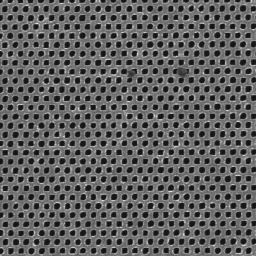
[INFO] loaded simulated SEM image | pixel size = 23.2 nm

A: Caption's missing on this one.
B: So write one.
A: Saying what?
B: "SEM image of a regular array of holes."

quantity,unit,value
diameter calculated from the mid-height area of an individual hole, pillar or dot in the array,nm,144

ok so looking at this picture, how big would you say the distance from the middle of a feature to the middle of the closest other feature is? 232 nm